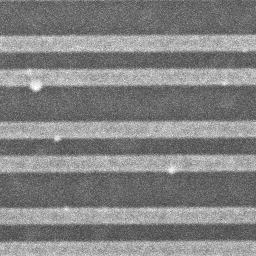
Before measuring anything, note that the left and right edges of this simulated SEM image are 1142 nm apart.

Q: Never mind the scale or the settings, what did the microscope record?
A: parallel lines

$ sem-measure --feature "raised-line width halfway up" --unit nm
63.6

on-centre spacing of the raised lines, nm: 192